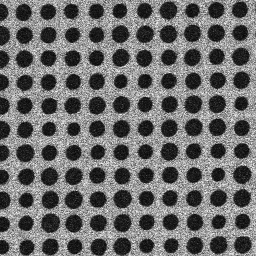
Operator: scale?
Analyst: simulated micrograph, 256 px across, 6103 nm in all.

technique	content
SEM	a regular array of holes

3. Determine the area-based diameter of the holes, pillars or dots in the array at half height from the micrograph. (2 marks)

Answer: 397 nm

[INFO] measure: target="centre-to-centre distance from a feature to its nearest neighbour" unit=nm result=556